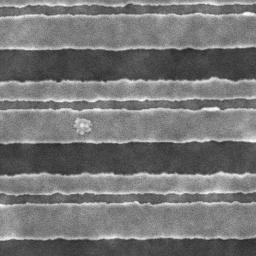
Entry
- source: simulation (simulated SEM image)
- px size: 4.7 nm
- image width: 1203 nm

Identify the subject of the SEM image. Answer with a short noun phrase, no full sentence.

lines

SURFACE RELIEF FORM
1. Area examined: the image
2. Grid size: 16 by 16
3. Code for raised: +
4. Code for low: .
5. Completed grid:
++++++++++++++++
++++++++++++++++
++++++++++++++++
................
................
++++++++++++++++
++++++++++++++++
++++++++++++++++
++++++++++++++++
................
................
++++++++++++++++
++++++++++++++++
++++++++++++++++
++++++++++++++++
................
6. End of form